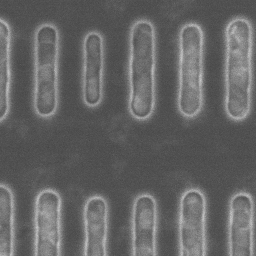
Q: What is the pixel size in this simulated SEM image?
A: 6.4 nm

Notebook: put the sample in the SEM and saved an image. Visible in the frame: holes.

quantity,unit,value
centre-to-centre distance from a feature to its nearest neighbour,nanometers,306